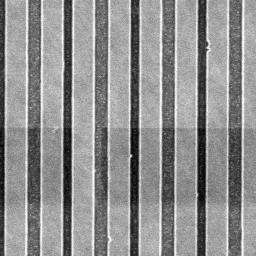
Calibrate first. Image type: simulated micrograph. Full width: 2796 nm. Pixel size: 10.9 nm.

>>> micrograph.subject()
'parallel lines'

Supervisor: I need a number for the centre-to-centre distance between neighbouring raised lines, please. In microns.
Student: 0.366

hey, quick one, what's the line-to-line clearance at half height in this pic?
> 152 nm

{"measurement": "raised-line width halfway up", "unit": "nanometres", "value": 232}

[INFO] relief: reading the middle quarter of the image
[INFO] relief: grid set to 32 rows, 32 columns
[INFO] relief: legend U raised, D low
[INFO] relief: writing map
DDUUUUUDDDDUUUUUDDDUUUUUDDDDUUUU
DDUUUUUDDDDUUUUUDDDUUUUUDDDDUUUU
DDUUUUUDDDDUUUUUDDDUUUUUDDDDUUUU
DDUUUUUDDDDUUUUUDDDUUUUUDDDDUUUU
DDUUUUUDDDDUUUUUDDDUUUUUDDDDUUUU
DDUUUUUDDDDUUUUUDDDUUUUUDDDDUUUU
DDUUUUUDDDDUUUUUDDDUUUUUDDDDUUUU
DDUUUUUDDDDUUUUUDDDUUUUUDDDDUUUU
DDUUUUUDDDDUUUUUDDDUUUUUDDDDUUUU
DDUUUUUDDDDUUUUUDDDUUUUUDDDDUUUU
DDUUUUUDDDDUUUUUDDDUUUUUDDDDUUUU
DDUUUUUDDDDUUUUUDDDUUUUUDDDDUUUU
DDUUUUUDDDDUUUUUDDDUUUUUDDDDUUUU
DDUUUUUDDDDUUUUUDDDUUUUUDDDDUUUU
DDUUUUUDDDDUUUUUDDDUUUUUDDDDUUUU
DDUUUUUDDDDUUUUUDDDUUUUUDDDDUUUU
DDUUUUUDDDDUUUUUDDDUUUUUDDDDUUUU
DDUUUUUDDDDUUUUUDDDUUUUUDDDDUUUU
DDUUUUUDDDDUUUUUDDDUUUUUDDDDUUUU
DDUUUUUDDDDUUUUUDDDUUUUUDDDDUUUU
DDUUUUUDDDDUUUUUDDDUUUUUDDDDUUUU
DDUUUUUDDDDUUUUUDDDUUUUUDDDDUUUU
DDUUUUUDDDDUUUUUUDDUUUUUDDDDUUUU
DDUUUUUDDDDUUUUUUDDUUUUUDDDDUUUU
DDUUUUUDDDDUUUUUDDDUUUUUDDDDUUUU
DDUUUUUDDDDUUUUUDDDUUUUUDDDDUUUU
DDUUUUUUDDDUUUUUDDDUUUUUDDDDUUUU
DDUUUUUDDDDUUUUUDDDUUUUUDDDDUUUU
DDUUUUUDDDDUUUUUDDDUUUUUDDDDUUUU
DDUUUUUDDDDUUUUUDDDUUUUUDDDDUUUU
DDUUUUUDDDDUUUUUDDDUUUUUDDDDUUUU
DDUUUUUDDDDUUUUUDDDUUUUUDDDDUUUU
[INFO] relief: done